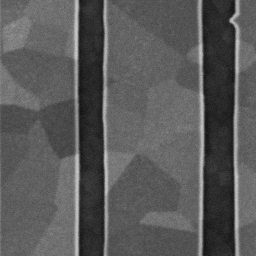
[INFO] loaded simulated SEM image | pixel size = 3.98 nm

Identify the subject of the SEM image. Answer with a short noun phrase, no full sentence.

one or a few lines or trenches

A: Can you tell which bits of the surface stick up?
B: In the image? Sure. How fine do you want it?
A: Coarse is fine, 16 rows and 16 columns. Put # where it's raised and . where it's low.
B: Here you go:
#####..######..#
#####..######..#
#####..######..#
#####..######..#
#####..######..#
#####..######..#
#####.#######..#
#####.#######..#
#####..######..#
#####..######..#
#####..######..#
#####..######..#
#####..######..#
#####..######..#
#####..######..#
#####..######..#